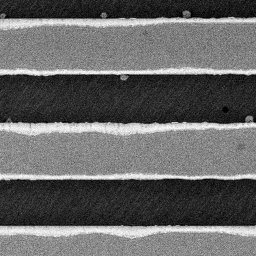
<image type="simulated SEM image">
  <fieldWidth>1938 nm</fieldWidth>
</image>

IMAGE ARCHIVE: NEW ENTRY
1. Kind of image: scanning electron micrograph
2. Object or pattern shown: lines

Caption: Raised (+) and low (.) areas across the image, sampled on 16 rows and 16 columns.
................
++++++++++++++++
++++++++++++++++
++++++++++++++++
++++++++++++++++
................
................
................
++++++++++++++++
++++++++++++++++
++++++++++++++++
................
................
................
++++++++++++++++
++++++++++++++++